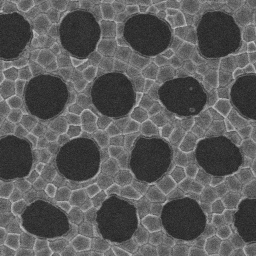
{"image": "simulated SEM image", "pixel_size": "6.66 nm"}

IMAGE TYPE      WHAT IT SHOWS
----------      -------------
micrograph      a regular array of raised bodies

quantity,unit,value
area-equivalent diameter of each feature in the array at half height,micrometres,0.3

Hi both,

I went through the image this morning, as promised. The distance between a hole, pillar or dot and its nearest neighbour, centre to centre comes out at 0.456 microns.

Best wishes